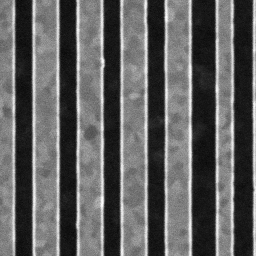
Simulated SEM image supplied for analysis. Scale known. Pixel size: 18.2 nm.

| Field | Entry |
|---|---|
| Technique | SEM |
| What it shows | parallel lines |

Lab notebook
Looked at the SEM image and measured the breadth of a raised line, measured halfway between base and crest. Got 442 nanometres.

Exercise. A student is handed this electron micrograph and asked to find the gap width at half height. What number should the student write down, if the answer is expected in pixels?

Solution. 19.4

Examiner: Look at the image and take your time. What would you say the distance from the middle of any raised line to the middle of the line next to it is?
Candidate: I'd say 44.7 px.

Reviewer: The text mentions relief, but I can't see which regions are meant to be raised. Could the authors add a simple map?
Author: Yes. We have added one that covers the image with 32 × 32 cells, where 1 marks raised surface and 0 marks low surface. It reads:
11001110001110011100011100011000
11001110001110011100011100011000
11001110001110011100011100011000
11001110001110011100011100011000
11001110001110011100011100011000
11001110001110011100011100011000
11001110001110011100011100011000
11001110001110011100011100011000
11001110001110011100011100011000
11001110001110011100011100011000
11001110001110011100011100011000
11001110001110011100011100011000
11001110001110011100011100011000
11001110001110011100011100011000
11001110001110011100011100011000
11001110001110011100011100011000
11001110001110011100011100011000
11001110001110011100011100011000
11001110001110011100011100011000
11001110001110011100011100011000
11001110001110011100011100011000
11001110001110011100011100011000
11001110001110011100011100011000
11001110001110011100011100011000
11001110001110011100011100011000
11001110001110011100011100011000
11001110001110011100011100011000
11001110001110011100011100011000
11001110001110011100011100011000
11001110001110011100011100011000
11001110001110011100011100011000
11001110001110011100011100011000